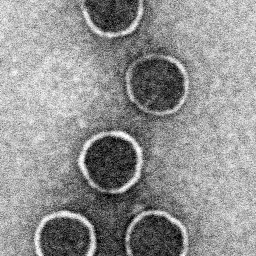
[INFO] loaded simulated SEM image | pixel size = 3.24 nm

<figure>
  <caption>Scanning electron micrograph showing raised bodies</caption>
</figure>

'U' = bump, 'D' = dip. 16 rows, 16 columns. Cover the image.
DDDDDUUUUDDDDDDD
DDDDDDUUUDDDDDDD
DDDDDDDDDDDDDDDD
DDDDDDDDDUDDDDDD
DDDDDDDDUUUUDDDD
DDDDDDDDUUUUDDDD
DDDDDDDDDUUDDDDD
DDDDDDDDDDDDDDDD
DDDDDDUUDDDDDDDD
DDDDDUUUUDDDDDDD
DDDDDUUUUDDDDDDD
DDDDDDUUDDDDDDDD
DDDDDDDDDDDDDDDD
DDDUUDDDDUUDDDDD
DDUUUUDDUUUUDDDD
DDUUUUDDUUUUDDDD